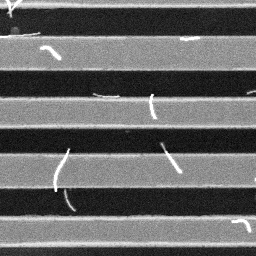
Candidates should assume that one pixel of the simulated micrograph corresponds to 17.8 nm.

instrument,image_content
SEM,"lines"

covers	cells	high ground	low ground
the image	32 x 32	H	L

HHHHHHHHHHHHHHHHHHHHHHHHHHHHHHHH
LLLLLLLLLLLLLLLLLLLLLLLLLLLLLLLL
LLLLLLLLLLLLLLLLLLLLLLLLLLLLLLLL
LLLLLLLLLLLLLLLLLLLLLLLLLLLLLLLL
LLLLLLLLLLLLLLLLLLLLLLLLLLLLLLLL
HHHHHHHHHHHHHHHHHHHHHHHHHHHHHHHH
HHHHHHHHHHHHHHHHHHHHHHHHHHHHHHHH
HHHHHHHHHHHHHHHHHHHHHHHHHHHHHHHH
HHHHHHHHHHHHHHHHHHHHHHHHHHHHHHHH
LLLLLLLLLLLLLLLLLLLLLLLLLLLLLLLL
LLLLLLLLLLLLLLLLLLLLLLLLLLLLLLLL
LLLLLLLLLLLLLLLLLLLLLLLLLLLLLLLL
HHHHHHHHHHHHHHHHHHHHHHHHHHHHHHHH
HHHHHHHHHHHHHHHHHHHHHHHHHHHHHHHH
HHHHHHHHHHHHHHHHHHHHHHHHHHHHHHHH
HHHHHHHHHHHHHHHHHHHHHHHHHHHHHHHH
LLLLLLLLLLLLLLLLLLLLLLLLLLLLLLLL
LLLLLLLLLLLLLLLLLLLLLLLLLLLLLLLL
LLLLLLLLLLLLLLLLLLLLLLLLLLLLLLLL
HHHHHHHHHHHHHHHHHHHHHHHHHHHHHHHH
HHHHHHHHHHHHHHHHHHHHHHHHHHHHHHHH
HHHHHHHHHHHHHHHHHHHHHHHHHHHHHHHH
HHHHHHHHHHHHHHHHHHHHHHHHHHHHHHHH
LLLLLLHHLLLLLLLLLLLLLLLLLLLLLLLL
LLLLLLLLLLLLLLLLLLLLLLLLLLLLLLLL
LLLLLLLLLLLLLLLLLLLLLLLLLLLLLLLL
LLLLLLLLLLLLLLLLLLLLLLLLLLLLLLLL
HHHHHHHHHHHHHHHHHHHHHHHHHHHHHHHH
HHHHHHHHHHHHHHHHHHHHHHHHHHHHHHHH
HHHHHHHHHHHHHHHHHHHHHHHHHHHHHHHH
HHHHHHHHHHHHHHHHHHHHHHHHHHHHHHHH
LLLLLLLLLLLLLLLLLLLLLLLLLLLLLLLL